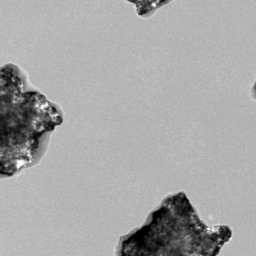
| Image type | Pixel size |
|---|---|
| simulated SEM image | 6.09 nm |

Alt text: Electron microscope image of holes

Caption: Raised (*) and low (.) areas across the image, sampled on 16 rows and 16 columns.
********..******
****************
****************
****************
.***************
..**************
...*************
....************
...*************
...*************
..**************
****************
**********..****
*********...****
********......**
********......**